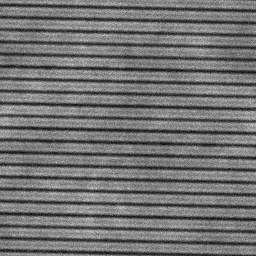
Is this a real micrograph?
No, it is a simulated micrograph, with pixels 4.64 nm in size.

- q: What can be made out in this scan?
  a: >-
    parallel lines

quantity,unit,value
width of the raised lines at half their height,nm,40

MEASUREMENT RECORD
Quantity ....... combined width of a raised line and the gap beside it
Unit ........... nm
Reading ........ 57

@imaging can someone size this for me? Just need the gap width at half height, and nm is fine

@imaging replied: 16.2